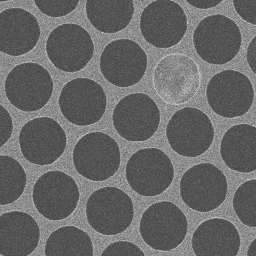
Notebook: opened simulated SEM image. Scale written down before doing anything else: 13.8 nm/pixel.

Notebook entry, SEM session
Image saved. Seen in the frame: a regular array of holes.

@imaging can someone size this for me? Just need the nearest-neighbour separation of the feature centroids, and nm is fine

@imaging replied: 771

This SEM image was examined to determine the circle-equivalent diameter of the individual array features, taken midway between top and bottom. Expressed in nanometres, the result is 669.